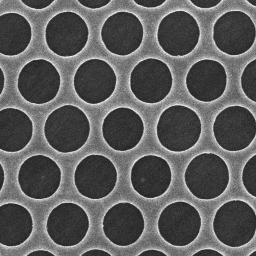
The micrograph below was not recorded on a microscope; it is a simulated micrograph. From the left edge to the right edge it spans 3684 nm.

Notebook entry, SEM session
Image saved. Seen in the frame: a regular array of holes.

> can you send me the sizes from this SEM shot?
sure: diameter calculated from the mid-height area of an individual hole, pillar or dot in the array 629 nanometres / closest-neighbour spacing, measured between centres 0.79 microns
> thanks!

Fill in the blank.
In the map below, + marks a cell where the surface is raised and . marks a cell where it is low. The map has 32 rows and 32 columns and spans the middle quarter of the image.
++++........++++++........++++++
+++.........+++++.........+++++.
+++..........++++..........++++.
+++..........++++..........++++.
++...........++++..........+++..
+++..........++++..........++++.
+++..........++++..........++++.
+++.........+++++.........++++++
++++.......+++++++.......+++++++
+++++.....++++++++++....++++++++
...++++++++++++++++++++++++...++
....++++++++.....++++++++.......
.....++++++.......++++++........
......++++.........+++++........
......++++..........+++.........
.......+++..........+++.........
.......++...........+++.........
......++++..........+++.........
......++++.........++++.........
.....++++++........+++++........
.....++++++.......+++++++.......
...++++++++++...++++++++++.....+
+++++++.++++++++++++++++++++++++
+++++......++++++++......+++++++
++++........++++++........++++++
+++..........++++.........+++++.
+++..........++++..........+++..
++...........++++..........+++..
++...........++++..........+++..
+++..........++++..........+++..
+++..........++++.........+++++.
+++.........++++++........+++++.